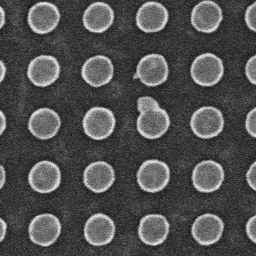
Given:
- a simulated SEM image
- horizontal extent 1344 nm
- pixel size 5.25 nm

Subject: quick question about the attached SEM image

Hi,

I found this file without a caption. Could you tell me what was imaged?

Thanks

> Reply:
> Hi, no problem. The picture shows a regular array of raised bodies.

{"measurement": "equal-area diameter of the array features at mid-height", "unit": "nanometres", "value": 159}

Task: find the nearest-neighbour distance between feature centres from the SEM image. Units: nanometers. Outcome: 278